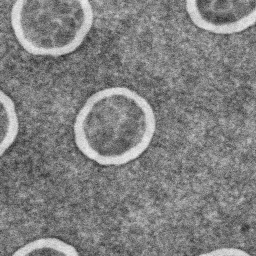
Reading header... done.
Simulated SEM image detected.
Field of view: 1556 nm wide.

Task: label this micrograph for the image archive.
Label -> raised bodies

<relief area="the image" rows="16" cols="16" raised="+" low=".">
.++++.......++++
.++++........++.
.++++...........
................
................
................
+.....+++.......
+....++++.......
+....++++.......
......++........
................
................
................
................
................
..++............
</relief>